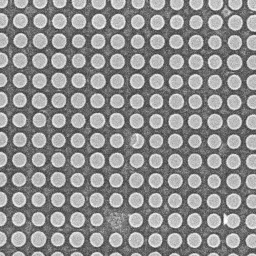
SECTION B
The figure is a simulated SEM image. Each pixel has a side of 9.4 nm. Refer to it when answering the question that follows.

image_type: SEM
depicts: a regular array of raised bodies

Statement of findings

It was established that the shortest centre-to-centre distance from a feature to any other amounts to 180 nanometres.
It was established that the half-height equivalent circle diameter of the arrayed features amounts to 134 nanometres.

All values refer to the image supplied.